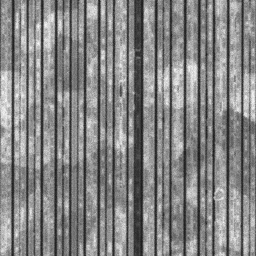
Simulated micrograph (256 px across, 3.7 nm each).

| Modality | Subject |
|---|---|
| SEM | parallel lines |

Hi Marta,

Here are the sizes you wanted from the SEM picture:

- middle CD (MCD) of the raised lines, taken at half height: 18.5 nm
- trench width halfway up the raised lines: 11.1 nanometers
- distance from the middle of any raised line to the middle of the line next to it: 26.5 nanometers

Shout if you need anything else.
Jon